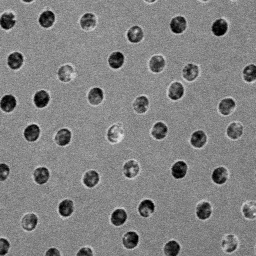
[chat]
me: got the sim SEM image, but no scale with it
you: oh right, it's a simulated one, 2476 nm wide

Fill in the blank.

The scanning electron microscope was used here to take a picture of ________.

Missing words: a regular array of holes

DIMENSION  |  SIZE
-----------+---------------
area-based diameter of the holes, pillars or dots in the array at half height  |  169 nm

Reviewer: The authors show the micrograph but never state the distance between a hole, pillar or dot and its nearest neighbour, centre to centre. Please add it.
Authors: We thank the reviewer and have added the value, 352 nanometres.